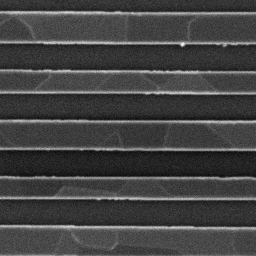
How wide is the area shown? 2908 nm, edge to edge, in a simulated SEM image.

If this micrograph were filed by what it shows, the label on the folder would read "lines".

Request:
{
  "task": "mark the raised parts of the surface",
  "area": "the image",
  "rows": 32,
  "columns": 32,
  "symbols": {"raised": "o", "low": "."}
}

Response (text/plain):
................................
................................
oooooooooooooooooooooooooooooooo
oooooooooooooooooooooooooooooooo
oooooooooooooooooooooooooooooooo
......................oo.....oo.
................................
................................
................................
oooooooooooooooooooooooooooooooo
oooooooooooooooooooooooooooooooo
oooooooooooooooooooooooooooooooo
................................
................................
................................
oooooooooooooooooooooooooooooooo
oooooooooooooooooooooooooooooooo
oooooooooooooooooooooooooooooooo
oooooooooooooooooooooooooooooooo
................................
................................
................................
oooooooooooooooooooooooooooooooo
oooooooooooooooooooooooooooooooo
oooooooooooooooooooooooooooooooo
................................
................................
................................
oooooooooooooooooooooooooooooooo
oooooooooooooooooooooooooooooooo
oooooooooooooooooooooooooooooooo
oooooooooooooooooooooooooooooooo